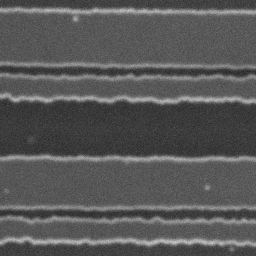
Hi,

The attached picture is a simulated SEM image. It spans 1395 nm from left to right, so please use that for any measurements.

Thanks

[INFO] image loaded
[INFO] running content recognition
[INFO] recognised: lines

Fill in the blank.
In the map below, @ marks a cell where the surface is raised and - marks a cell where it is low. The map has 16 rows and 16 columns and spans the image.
----------------
@@@@@@@@@@@@@@@@
@@@@@@@@@@@@@@@@
@@@@@@@@@@@@@@@@
@@@@@@@@@@@@@@@@
@@@@@@@@@@@@@@@@
----------------
----------------
----------------
----------------
@@@@@@@@@@@@@@@@
@@@@@@@@@@@@@@@@
@@@@@@@@@@@@@@@@
@@@@@@@@@@@@@@@@
@@@@@@@@@@@@@@@@
----------------